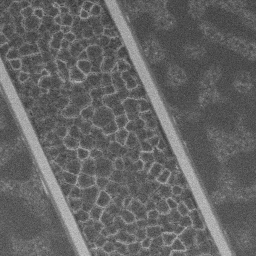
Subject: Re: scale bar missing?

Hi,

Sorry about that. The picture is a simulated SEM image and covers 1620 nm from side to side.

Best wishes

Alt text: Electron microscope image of one or a few lines or trenches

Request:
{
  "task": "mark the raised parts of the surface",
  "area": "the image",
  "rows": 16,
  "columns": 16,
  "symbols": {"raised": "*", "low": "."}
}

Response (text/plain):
.......*********
........********
........********
........********
.........*******
*........*******
*.........******
**........******
**.........*****
**.........*****
***.........****
***.........****
****.........***
****.........***
*****........***
*****.........**